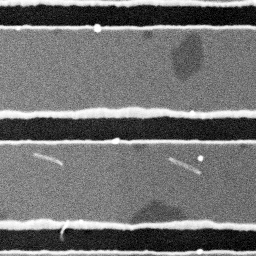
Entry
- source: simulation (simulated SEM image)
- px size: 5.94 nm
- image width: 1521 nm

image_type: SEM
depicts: lines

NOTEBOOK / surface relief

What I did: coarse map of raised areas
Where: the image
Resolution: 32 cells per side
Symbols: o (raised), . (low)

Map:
..............o..........ooooo..
................................
................................
oooooooooooooooooooooooooooooooo
oooooooooooooooooooooooooooooooo
oooooooooooooooooooooooooooooooo
oooooooooooooooooooooooooooooooo
oooooooooooooooooooooooooooooooo
oooooooooooooooooooooooooooooooo
oooooooooooooooooooooooooooooooo
oooooooooooooooooooooooooooooooo
oooooooooooooooooooooooooooooooo
oooooooooooooooooooooooooooooooo
oooooooooooooooooooooooooooooooo
.........................o......
................................
................................
..............o.................
oooooooooooooooooooooooooooooooo
oooooooooooooooooooooooooooooooo
oooooooooooooooooooooooooooooooo
oooooooooooooooooooooooooooooooo
oooooooooooooooooooooooooooooooo
oooooooooooooooooooooooooooooooo
oooooooooooooooooooooooooooooooo
oooooooooooooooooooooooooooooooo
oooooooooooooooooooooooooooooooo
oooooooooooooooooooooooooooooooo
................................
................................
................................
ooooooo.oooooooooooo...ooooooooo